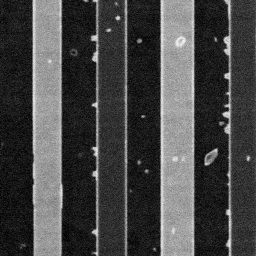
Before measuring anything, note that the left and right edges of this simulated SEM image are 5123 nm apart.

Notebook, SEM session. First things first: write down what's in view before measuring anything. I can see lines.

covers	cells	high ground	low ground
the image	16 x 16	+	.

..++..++..++..++
..++..++..++..++
..++..++..++..++
..++..++..++..++
..++..++..++..++
..++..++..++..++
..++..++..++..++
..++..++..++..++
..++..++..++..++
..++..++..++..++
..++..++..++..++
..++..++..++..++
..++..++..++..++
..++..++..++..++
..++..++..++..++
..++..++..++..++